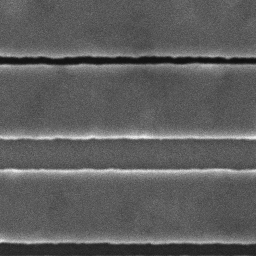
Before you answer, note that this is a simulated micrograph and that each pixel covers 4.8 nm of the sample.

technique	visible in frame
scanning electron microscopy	lines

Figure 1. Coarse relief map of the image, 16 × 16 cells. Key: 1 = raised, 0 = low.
1111111111111111
1111111111111111
1111111111111111
1111111111111111
1111111111111111
1111111111111111
1111111111111111
1111111111111111
1111111111111111
0000000000000000
0000000000000000
1111111111111111
1111111111111111
1111111111111111
1111111111111111
0000000000000000